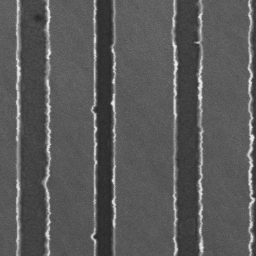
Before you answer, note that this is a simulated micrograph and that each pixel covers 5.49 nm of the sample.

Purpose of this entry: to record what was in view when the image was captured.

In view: one or a few lines or trenches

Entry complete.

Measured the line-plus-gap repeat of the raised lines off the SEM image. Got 423 nm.